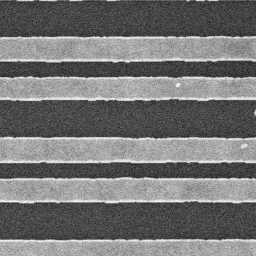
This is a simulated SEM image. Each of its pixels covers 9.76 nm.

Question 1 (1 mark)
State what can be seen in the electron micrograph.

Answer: lines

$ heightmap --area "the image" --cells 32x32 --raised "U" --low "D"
DDDDDDDDDDDDDDDDDDDDDDDDDDDDDDDD
DDDDDDDDDDDDDDDDDDDDDDDDDDDDDDDD
DDDDDDDDDDDDDDDDDDDDDDDDDDDDDDDD
DDDDDDDDDDDDDDDDDDDDDDDDDDDDDDDD
DDDDDDDDDDDDDDDDDDDDDDDDDDDDDDDD
UUUUUUUUUUUUUUUUUUUUUUUUUUUUUUUU
UUUUUUUUUUUUUUUUUUUUUUUUUUUUUUUU
UUDUUUUUUUUUUUUUUUDUDDDDUUDDDDDD
DDDDDDDDDDDDDDDDDDDDDDDDDDDDDDDD
DDDDDDDDDDDDDDDDDDDDDDDDDDDDDDDD
UUUUUUUUUUUUUUUUUUUUUUUUUUUUUUUU
UUUUUUUUUUUUUUUUUUUUUUUUUUUUUUUU
DDUUUDDDDDDDDDDUUDDDDDDDDUDDDDDD
DDDDDDDDDDDDDDDDDDDDDDDDDDDDDDDD
DDDDDDDDDDDDDDDDDDDDDDDDDDDDDDDD
DDDDDDDDDDDDDDDDDDDDDDDDDDDDDDDD
DDDDDDDDDDDDDDDDDDDDDDDDDDDDDDDD
UUUUUUUUUUUUUUUUUUUUUUUUUUUUUUUU
UUUUUUUUUUUUUUUUUUUUUUUUUUUUUUUU
UUUUUUUUUUUUUUUUUUUUUUUUUUUUUUUU
DDDDDDDDDDDDDDDDDDDDDDDDDDDDDDDD
DDDDDDDDDDDDDDDDDDDDDDDDDDDDDDDD
UUUUUUUUUUUUUUUUUUUUUUUUUUUUUUUU
UUUUUUUUUUUUUUUUUUUUUUUUUUUUUUUU
UUUUUUUUUUUUUUUUUUUUUUUUUUUUUUUU
DDDDDDDDDDDDDDDDDDDDDDDDDDDDDDDD
DDDDDDDDDDDDDDDDDDDDDDDDDDDDDDDD
DDDDDDDDDDDDDDDDDDDDDDDDDDDDDDDD
DDDDDDDDDDDDDDDDDDDDDDDDDDDDDDDD
DDDDDDDDDDDDDDDDDDDDDDDDDDDDDDDD
UUUUUUUUUUUUUUUUUUUUUUUUUUUUUUUU
UUUUUUUUUUUUUUUUUUUUUUUUUUUUUUUU